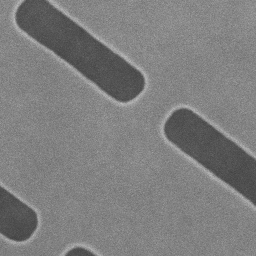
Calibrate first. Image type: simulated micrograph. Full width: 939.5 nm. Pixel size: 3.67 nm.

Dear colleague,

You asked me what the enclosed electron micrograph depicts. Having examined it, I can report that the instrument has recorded holes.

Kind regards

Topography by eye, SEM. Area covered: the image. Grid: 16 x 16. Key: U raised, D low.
UDDUUUUUUUUUUUUU
UDDDDUUUUUUUUUUU
UUDDDDUUUUUUUUUU
UUUUDDDDUUUUUUUU
UUUUUDDDDUUUUUUU
UUUUUUDDDUUUUUUU
UUUUUUUUUUUUUUUU
UUUUUUUUUUDDDUUU
UUUUUUUUUUDDDDUU
UUUUUUUUUUUDDDDU
UUUUUUUUUUUUUDDD
UUUUUUUUUUUUUUDD
DUUUUUUUUUUUUUUD
DDUUUUUUUUUUUUUU
DDUUUUUUUUUUUUUU
UUUUUUUUUUUUUUUU